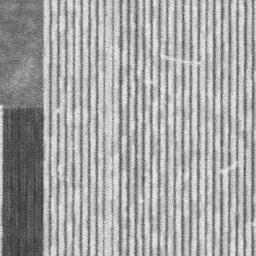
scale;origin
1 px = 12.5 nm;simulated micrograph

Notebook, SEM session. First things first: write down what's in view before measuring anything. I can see parallel lines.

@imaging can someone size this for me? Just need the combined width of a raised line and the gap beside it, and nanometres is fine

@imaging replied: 97.5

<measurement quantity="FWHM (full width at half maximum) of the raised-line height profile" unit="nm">54.8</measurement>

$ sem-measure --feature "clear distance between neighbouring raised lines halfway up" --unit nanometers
42.3